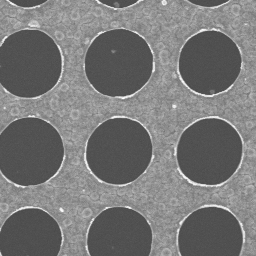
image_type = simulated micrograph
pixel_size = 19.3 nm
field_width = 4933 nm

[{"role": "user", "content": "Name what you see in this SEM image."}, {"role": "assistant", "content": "holes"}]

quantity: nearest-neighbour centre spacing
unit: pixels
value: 88.6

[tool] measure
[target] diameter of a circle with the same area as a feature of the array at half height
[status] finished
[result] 1290 nm